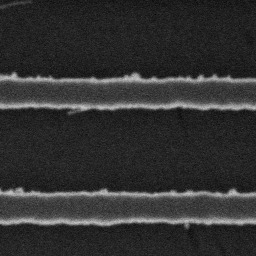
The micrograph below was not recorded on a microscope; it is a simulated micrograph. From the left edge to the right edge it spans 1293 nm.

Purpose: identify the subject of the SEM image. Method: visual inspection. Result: lines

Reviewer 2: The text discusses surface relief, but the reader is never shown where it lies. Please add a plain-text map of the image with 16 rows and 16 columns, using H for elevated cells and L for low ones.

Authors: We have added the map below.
LLLLLLLLLLLLLLLL
LLLLLLLLLLLLLLLL
LLLLLLLLLLLLLLLL
LLLLLLLLLLLLLLLL
LLLLLLLLLLLLLLLL
HHHHHHHHHHHHHHHH
HHHHHHHHHHHHHHHH
LLLLLLLLLLLLLLLL
LLLLLLLLLLLLLLLL
LLLLLLLLLLLLLLLL
LLLLLLLLLLLLLLLL
LLLLLLLLLLLLLLLL
HHHHHHHHHHHHHHHH
HHHHHHHHHHHHHHHH
LLLLLLLLLLLLLLLL
LLLLLLLLLLLLLLLL